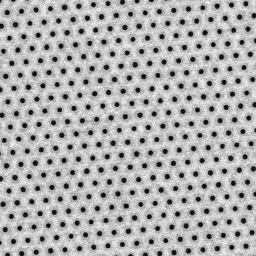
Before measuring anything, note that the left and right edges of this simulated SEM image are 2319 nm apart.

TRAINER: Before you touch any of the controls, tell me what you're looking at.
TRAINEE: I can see a regular array of holes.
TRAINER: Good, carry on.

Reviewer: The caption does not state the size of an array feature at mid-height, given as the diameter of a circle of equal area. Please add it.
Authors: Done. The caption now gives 46.8 nm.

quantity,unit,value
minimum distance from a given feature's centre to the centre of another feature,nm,128